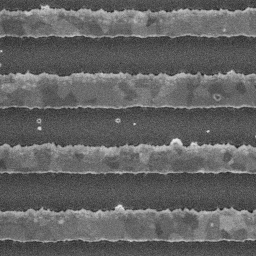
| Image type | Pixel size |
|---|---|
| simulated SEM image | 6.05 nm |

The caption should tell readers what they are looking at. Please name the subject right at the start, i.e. lines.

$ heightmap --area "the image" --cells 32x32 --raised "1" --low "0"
00000000000000000000000000000000
10111111111110011010101111111111
11111111111111111111111111111111
11111111111111111111111111111111
11111101100111110111011001111001
00000000000000000000000000000000
00000000000000000000000000000000
00000000000000000000000000000000
00000000000000000000000000000000
01111110011111111111101111111111
11111111111111111111111111111111
11111111111111111111111111111111
11111111111111111111111111111111
00000001000000100000000100000000
00000000000000000000000000000000
00000000000000000000000000000000
00000000000000000000000000000000
00000000000000000000000000000000
11111111111110111111111111111111
11111111111111111111111111111111
11111111111111111111111111111111
11111111111111111111111111110111
00000000000000000000000000000000
00000000000000000000000000000000
00000000000000000000000000000000
00000000000000000000000000000000
01011110111011111111111111111110
11111111111111111111111111111111
11111111111111111111111111111111
11111111111111111111111111111111
00000000000000000000000000000000
00000000000000000000000000000000